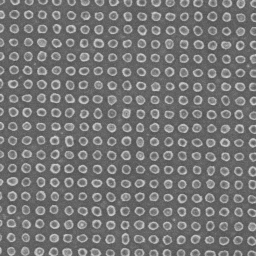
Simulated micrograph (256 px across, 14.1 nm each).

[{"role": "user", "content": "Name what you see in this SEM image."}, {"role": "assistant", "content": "a regular array of raised bodies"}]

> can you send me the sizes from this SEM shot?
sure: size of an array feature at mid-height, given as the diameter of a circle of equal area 119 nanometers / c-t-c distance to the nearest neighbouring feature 191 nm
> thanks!